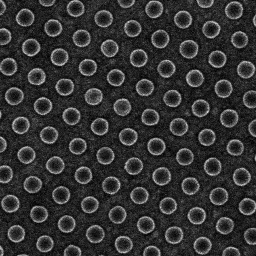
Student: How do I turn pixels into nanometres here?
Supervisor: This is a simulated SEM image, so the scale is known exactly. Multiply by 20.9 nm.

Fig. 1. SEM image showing a regular array of raised bodies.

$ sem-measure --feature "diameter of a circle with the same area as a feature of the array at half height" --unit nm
354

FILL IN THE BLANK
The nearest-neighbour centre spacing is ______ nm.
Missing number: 614